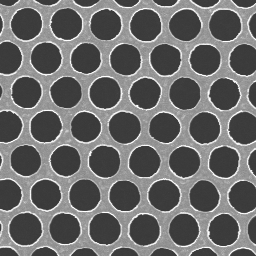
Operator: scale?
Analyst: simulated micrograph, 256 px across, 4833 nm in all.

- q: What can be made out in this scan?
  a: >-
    a regular array of holes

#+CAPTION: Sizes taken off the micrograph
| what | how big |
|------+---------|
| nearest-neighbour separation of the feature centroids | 739 nanometers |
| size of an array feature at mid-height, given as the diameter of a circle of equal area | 31.2 pixels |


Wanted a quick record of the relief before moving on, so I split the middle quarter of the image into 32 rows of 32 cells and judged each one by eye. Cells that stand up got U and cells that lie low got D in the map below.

UUDDDDDDDUUUDDDDDDDUUUDDDDDDDUUU
UUUDDDDDUUUUUDDDDDUUUUUDDDDDUUUU
UUUUUUUUUUUUUUDDDUUUUUUUDDDUUUUU
DDUUUUUUUDDDUUUUUUUDDUUUUUUUUDDU
DDDUUUUDDDDDDUUUUUDDDDDUUUUUDDDD
DDDDUUUDDDDDDDUUUDDDDDDDUUUDDDDD
DDDDDUDDDDDDDDUUDDDDDDDDUUDDDDDD
DDDDDUDDDDDDDDUUDDDDDDDDUUDDDDDD
DDDDUUDDDDDDDDUUUDDDDDDDUUDDDDDD
DDDDUUUDDDDDDDUUUDDDDDDDUUUDDDDD
DDDUUUUUDDDDDUUUUUDDDDDUUUUUDDDD
UUUUUUUUUUUUUUUUUUUUUUUUUUUUUUUU
UUUDDDDUUUUUUDDDDUUUUUUUDDUUUUUU
UUDDDDDDUUUUDDDDDDUUUUDDDDDDUUUU
UUDDDDDDDUUDDDDDDDDUUUDDDDDDDUUU
UUDDDDDDDUUDDDDDDDDUUDDDDDDDDUUD
UUDDDDDDDUUDDDDDDDDUUDDDDDDDDUUD
UUDDDDDDDUUUDDDDDDDUUUDDDDDDDUUU
UUUDDDDDUUUUDDDDDDUUUUDDDDDDUUUU
UUUUDDUUUUUUUDDDDUUUUUUUDDDUUUUU
DUUUUUUUUDUUUUUUUUUUDUUUUUUUUUUU
DDDUUUUDDDDDDUUUUUDDDDDUUUUUDDDD
DDDDUUUDDDDDDDUUUDDDDDDUUUUDDDDD
DDDDUUDDDDDDDDUUDDDDDDDDUUDDDDDD
DDDDUUDDDDDDDDUUDDDDDDDDUUDDDDDD
DDDDUUDDDDDDDDUUDDDDDDDDUUDDDDDD
DDDDUUUDDDDDDDUUUDDDDDDUUUUDDDDD
DDUUUUUUDDDDDUUUUUDDDDUUUUUUDDDD
UUUUUUUUUUDUUUUUUUUUUUUUUUUUUUUU
UUUDDDDUUUUUUDDDDUUUUUUDDDDUUUUU
UUDDDDDDUUUUDDDDDDUUUUDDDDDDUUUU
UDDDDDDDDUUUDDDDDDDUUDDDDDDDDUUU